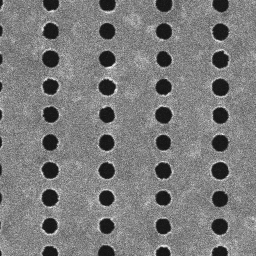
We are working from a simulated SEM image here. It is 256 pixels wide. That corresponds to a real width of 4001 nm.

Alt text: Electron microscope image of a regular array of holes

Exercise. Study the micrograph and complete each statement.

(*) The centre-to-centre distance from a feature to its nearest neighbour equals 0.433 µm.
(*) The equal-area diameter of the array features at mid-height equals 262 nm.